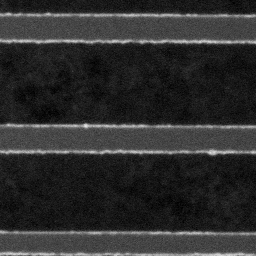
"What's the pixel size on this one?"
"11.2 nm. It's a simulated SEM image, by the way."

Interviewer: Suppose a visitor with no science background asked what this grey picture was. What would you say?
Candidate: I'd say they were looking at lines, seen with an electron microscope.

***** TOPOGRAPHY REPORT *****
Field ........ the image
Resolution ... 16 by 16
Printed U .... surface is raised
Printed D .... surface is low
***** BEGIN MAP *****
DDDDDDDDDDDDDDDD
UUUUUUUUUUUUUUUU
UUUUUUUUUUUUUUUU
DDDDDDDDDDDDDDDD
DDDDDDDDDDDDDDDD
DDDDDDDDDDDDDDDD
DDDDDDDDDDDDDDDD
DDDDDDDDDDDDDDDD
UUUUUUUUUUUUUUUU
UUUUUUUUUUUUUUUU
DDDDDDDDDDDDDDDD
DDDDDDDDDDDDDDDD
DDDDDDDDDDDDDDDD
DDDDDDDDDDDDDDDD
UUDDUDDDDDDDDDDD
UUUUUUUUUUUUUUUU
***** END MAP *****